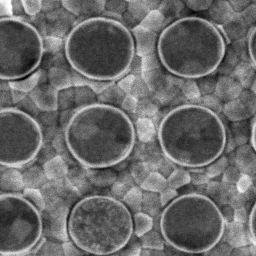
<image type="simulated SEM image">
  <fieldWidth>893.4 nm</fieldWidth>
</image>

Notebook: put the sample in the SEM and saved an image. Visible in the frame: raised bodies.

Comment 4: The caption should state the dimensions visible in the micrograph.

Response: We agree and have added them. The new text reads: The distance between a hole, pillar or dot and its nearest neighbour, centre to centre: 307 nm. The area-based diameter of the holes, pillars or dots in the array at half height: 217 nm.